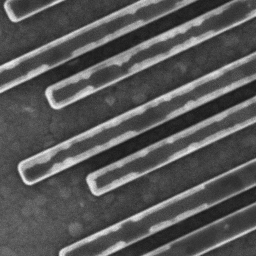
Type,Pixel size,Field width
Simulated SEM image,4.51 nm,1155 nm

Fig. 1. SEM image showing parallel lines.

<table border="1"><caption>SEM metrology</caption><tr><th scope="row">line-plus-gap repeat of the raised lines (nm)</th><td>217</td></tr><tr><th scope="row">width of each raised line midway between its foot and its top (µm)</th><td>0.101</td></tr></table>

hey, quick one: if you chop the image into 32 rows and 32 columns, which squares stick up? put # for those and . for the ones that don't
.######..........######.....####
.####..........######.....######
.............######.....#######.
..........#######.....#######...
........#######.....######......
......#######.....######........
....#######.....######..........
..######.....#######..........##
######.....#######..........####
####.....#######..........######
##.....#######..........######..
......#####...........######....
......###..........#######.....#
.................#######.....###
...............#######.....#####
.............#######.....######.
...........#######.....######...
.........#######....#######.....
.......######.....#######.......
.....######.....#######.........
...######.....#######..........#
...####.....######...........###
...##......#####..........######
...........###..........#######.
......................#######...
....................#######.....
..................#######.....##
................#######....#####
..............######.....#######
...........#######.....#######..
.........#######.....#######....
........######.....######.......